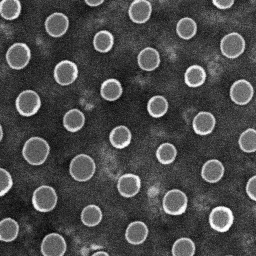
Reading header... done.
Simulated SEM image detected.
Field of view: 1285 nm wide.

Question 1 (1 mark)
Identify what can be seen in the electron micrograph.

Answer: a regular array of raised bodies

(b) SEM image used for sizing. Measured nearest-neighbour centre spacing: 0.242 microns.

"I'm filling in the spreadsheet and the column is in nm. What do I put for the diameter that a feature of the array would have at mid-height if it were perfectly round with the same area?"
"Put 112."